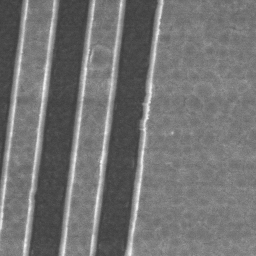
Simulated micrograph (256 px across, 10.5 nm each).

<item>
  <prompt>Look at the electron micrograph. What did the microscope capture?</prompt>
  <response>one or a few lines or trenches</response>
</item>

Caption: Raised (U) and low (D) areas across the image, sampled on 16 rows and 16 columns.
DUUUDDUUDDUUUUUU
DUUDDDUUDDUUUUUU
DUUDDUUDDDUUUUUU
DUUDDUUDDUUUUUUU
DUUDDUUDDUUUUUUU
DUUDDUUDDUUUUUUU
DUUDDUUDDUUUUUUU
DUUDDUUDDUUUUUUU
DUUDDUUDDUUUUUUU
UUDDDUUDDUUUUUUU
UUDDUUUDDUUUUUUU
UUDDUUDDDUUUUUUU
UUDDUUDDUUUUUUUU
UUDDUUDDUUUUUUUU
UUDDUUDDUUUUUUUU
UUDDUUDDUUUUUUUU